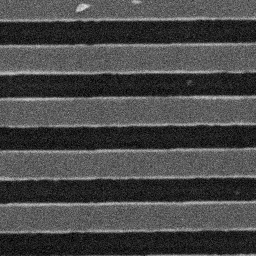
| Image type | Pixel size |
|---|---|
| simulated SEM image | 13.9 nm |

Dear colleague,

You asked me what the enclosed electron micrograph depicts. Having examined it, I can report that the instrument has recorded lines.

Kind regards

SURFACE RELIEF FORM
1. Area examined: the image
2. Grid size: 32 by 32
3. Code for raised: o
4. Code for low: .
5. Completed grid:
oooooooooooooooooooooooooooooooo
oooooooooooooooooooooooooooooooo
ooooooooooo.o...................
................................
................................
.....................ooooooooooo
oooooooooooooooooooooooooooooooo
oooooooooooooooooooooooooooooooo
oooooooooooooooooooooooooooooooo
................................
................................
................................
oooooooooooooooooooooooooooooooo
oooooooooooooooooooooooooooooooo
oooooooooooooooooooooooooooooooo
oooooooooooooooooooooooooooooooo
................................
................................
................................
oooooooooooooooooooooooooooooooo
oooooooooooooooooooooooooooooooo
oooooooooooooooooooooooooooooooo
................................
................................
................................
.ooooooooooooooooooooooooooooooo
oooooooooooooooooooooooooooooooo
oooooooooooooooooooooooooooooooo
oooooooooooooooooooooooooooooooo
................................
................................
................................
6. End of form